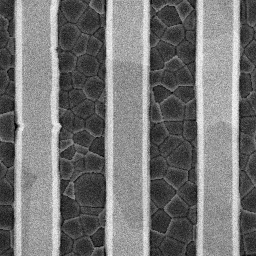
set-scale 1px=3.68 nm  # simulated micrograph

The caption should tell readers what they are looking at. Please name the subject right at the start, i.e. one or a few lines or trenches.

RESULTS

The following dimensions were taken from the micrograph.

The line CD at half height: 0.131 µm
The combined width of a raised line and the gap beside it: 0.334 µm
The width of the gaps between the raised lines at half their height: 201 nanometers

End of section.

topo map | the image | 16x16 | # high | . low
.##....##....##.
.##....##....##.
.##....##....##.
.##....##...###.
.##....##...###.
.##....##...###.
.##....##....##.
.##....##....##.
.##....##....##.
.##....##....##.
.##....##....##.
.##....##....##.
.##....##....##.
.##....##....##.
.##....##....##.
.##....##....##.